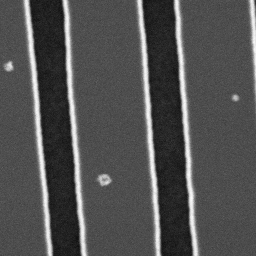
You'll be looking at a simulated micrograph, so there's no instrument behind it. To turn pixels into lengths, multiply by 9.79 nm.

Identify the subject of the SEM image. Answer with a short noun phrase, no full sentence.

lines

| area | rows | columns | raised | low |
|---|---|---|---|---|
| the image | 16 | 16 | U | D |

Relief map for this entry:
UUDDUUUUUDDUUUUU
UUDDUUUUUDDUUUUU
UUDDUUUUUDDUUUUU
UUDDUUUUUDDUUUUU
UUDDUUUUUDDUUUUU
UUDDUUUUUDDUUUUU
UUDDUUUUUDDUUUUU
UUDDUUUUUDDDUUUU
UUDDDUUUUDDDUUUU
UUUDDUUUUUDDUUUU
UUUDDUUUUUDDUUUU
UUUDDUUUUUDDUUUU
UUUDDUUUUUDDUUUU
UUUDDUUUUUDDUUUU
UUUDDUUUUUDDUUUU
UUUDDUUUUUDDUUUU